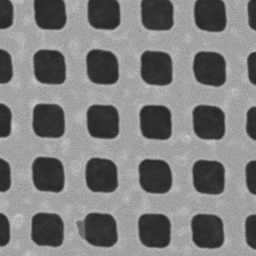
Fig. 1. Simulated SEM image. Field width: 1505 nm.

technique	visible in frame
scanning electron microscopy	a regular array of holes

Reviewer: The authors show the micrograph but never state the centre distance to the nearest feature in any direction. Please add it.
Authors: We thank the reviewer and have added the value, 314 nm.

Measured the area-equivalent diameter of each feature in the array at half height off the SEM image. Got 208 nm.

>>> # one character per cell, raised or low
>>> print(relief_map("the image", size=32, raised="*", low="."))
..**....***....***....**....***.
..**....***....***....**....***.
..**....***....***....**....***.
.****...****..****...****...***.
********************************
********************************
.****..****...****..*****..*****
.***....***....***...***....***.
..**....***....***....**....***.
.***....***....***....**....***.
************..*****..****...****
********************************
********************************
.***....***...****...***...****.
.***....***....**....***....***.
.***....***....**....***....***.
.***....***....***...***....***.
********************************
********************************
********************************
.***....***...****...***....***.
.***....***....**....***....***.
.***....***....**.....**....***.
.****...***....***...***....***.
********************************
********************************
********************************
.***....***...***....***....***.
.***....***....**....***....***.
.***....***....**....***....***.
.****...***...****...***....***.
********************************